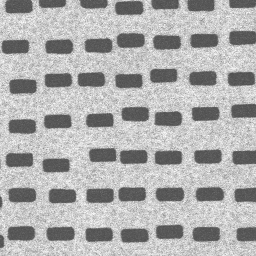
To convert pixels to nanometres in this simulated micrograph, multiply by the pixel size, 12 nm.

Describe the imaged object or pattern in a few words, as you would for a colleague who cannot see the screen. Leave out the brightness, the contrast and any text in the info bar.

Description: a regular array of holes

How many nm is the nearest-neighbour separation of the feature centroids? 411